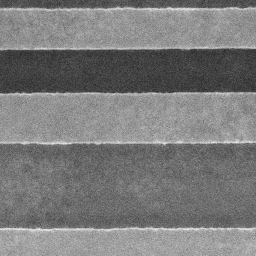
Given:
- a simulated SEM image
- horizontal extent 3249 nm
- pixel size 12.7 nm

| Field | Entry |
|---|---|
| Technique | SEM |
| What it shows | lines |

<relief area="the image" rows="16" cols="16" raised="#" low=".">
................
################
################
................
................
................
################
################
################
................
................
................
................
................
################
################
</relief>